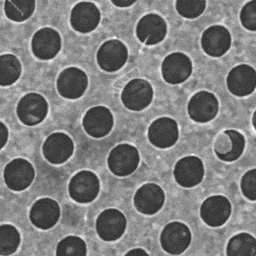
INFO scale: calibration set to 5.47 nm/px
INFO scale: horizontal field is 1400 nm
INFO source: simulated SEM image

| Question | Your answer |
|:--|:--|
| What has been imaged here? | a regular array of holes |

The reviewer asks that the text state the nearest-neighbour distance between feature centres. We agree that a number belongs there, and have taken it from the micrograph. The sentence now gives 0.256 um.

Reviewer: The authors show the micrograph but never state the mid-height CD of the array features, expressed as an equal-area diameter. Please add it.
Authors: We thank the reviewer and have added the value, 179 nm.